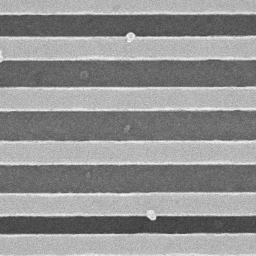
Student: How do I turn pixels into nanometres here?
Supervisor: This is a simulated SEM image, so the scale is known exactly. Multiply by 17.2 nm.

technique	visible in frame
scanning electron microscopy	lines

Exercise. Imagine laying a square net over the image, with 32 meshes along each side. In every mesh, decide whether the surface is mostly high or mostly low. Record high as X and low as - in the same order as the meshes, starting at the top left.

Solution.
XXXXXXXXXXXXXXXXXXXXXXXXXXXXXXXX
XXXXXXXXXXXXXXXXXXXXXXXXXXXXXXXX
--------------------------------
--------------------------------
----------------X---------------
XXXXXXXXXXXXXXXXXXXXXXXXXXXXXXXX
XXXXXXXXXXXXXXXXXXXXXXXXXXXXXXXX
X-------------------------------
--------------------------------
--------------------------------
--------------------------------
XXXXXXXXXXXXXXXXXXXXXXXXXXXXXXXX
XXXXXXXXXXXXXXXXXXXXXXXXXXXXXXXX
XXXXXXXXXXXXXXXXXXXXXXXXXXXXXXXX
--------------------------------
--------------------------------
--------------------------------
--------------------------------
XXXXXXXXXXXXXXXXXXXXXXXXXXXXXXXX
XXXXXXXXXXXXXXXXXXXXXXXXXXXXXXXX
XXXXXXXXXXXXXXXXXXXXXXXXXXXXXXXX
--------------------------------
--------------------------------
--------------------------------
XXXXXXXXXXXXXXXXXXXXXXXXXXXXXXXX
XXXXXXXXXXXXXXXXXXXXXXXXXXXXXXXX
XXXXXXXXXXXXXXXXXXXXXXXXXXXXXXXX
--------------------------------
--------------------------------
XXXXXXXXXXXXXXXXXXXXXXXXXXXXXXXX
XXXXXXXXXXXXXXXXXXXXXXXXXXXXXXXX
XXXXXXXXXXXXXXXXXXXXXXXXXXXXXXXX